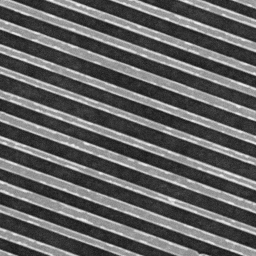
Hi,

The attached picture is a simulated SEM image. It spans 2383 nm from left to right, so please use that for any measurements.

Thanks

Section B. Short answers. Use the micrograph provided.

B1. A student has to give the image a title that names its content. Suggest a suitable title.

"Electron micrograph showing parallel lines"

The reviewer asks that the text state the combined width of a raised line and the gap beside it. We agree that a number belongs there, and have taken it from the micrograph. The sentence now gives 202 nm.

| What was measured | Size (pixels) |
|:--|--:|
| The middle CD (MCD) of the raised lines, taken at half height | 8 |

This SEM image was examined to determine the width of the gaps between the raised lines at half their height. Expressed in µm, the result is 0.123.